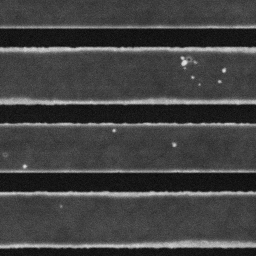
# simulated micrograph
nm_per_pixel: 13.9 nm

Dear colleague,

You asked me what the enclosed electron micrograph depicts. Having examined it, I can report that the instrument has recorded lines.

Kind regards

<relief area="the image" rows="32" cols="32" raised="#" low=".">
################################
################################
################################
................................
................................
................................
################################
################################
################################
################################
################################
################################
################################
................................
................................
#.####.###.#####.#####.#.######.
################################
################################
################################
################################
################################
................................
................................
................................
################################
################################
################################
################################
################################
################################
################################
................................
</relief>